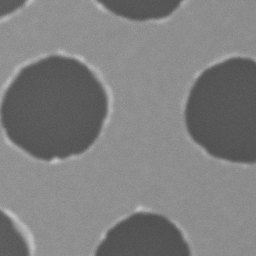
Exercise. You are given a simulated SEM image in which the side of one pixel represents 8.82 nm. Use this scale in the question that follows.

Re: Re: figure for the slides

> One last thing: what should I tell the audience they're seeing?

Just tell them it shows holes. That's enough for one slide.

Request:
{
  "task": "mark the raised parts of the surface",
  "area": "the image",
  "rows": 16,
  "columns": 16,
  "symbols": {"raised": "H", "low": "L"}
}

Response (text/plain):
LHHHHHLLLLLHHHHH
HHHHHHHHHHHHHHHH
HHHHHHHHHHHHHHHH
HHHLHHHHHHHHHHHH
HLLLLLHHHHHHHLLL
LLLLLLLHHHHHLLLL
LLLLLLLHHHHHLLLL
LLLLLLLHHHHHLLLL
LLLLLLHHHHHHLLLL
HHLLLHHHHHHHHLLL
HHHHHHHHHHHHHHHH
HHHHHHHHHHHHHHHH
HHHHHHHHHHHHHHHH
LHHHHHHHLLHHHHHH
LHHHHHHLLLLHHHHH
LLHHHHLLLLLLHHHH